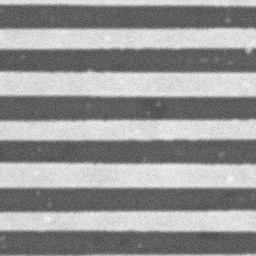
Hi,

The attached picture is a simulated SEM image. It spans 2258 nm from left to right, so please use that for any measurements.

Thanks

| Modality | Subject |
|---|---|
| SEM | lines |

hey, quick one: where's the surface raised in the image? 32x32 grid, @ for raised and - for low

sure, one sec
-----------@-@@@@@@@@@@@@@@@@@@@
--------------------------------
--------------------------------
--------------------------------
@@@@@@@@@@@@@@@@@@@@@@@@@@@@@@@@
@@@@@@@@@@@@@@@@@@@@@@@@@@@@@@@@
--------------------------------
--------------------------------
--------------------------------
@@@@@@@@@@@@@@@@@@@@@@@@@@@@@@@@
@@@@@@@@@@@@@@@@@@@@@@@@@@@@@@@@
@@@@@@@@@@@@@@@@@@@@@@@@@@@@@@@@
--------------------------------
--------------------------------
--------------------------------
@@@@@@@@@@@@@@@@@@@@@@@@@@@@@@@@
@@@@@@@@@@@@@@@@@@@@@@@@@@@@@@@@
--------------------------------
--------------------------------
--------------------------------
@@@@@@@@------------------------
@@@@@@@@@@@@@@@@@@@@@@@@@@@@@@@@
@@@@@@@@@@@@@@@@@@@@@@@@@@@@@@@@
--------------------------------
--------------------------------
--------------------------------
--------------------------@@-@@@
@@@@@@@@@@@@@@@@@@@@@@@@@@@@@@@@
@@@@@@@@@@@@@@@@@@@@@@@@@@@@@@@@
--------------------------------
--------------------------------
--------------------------------